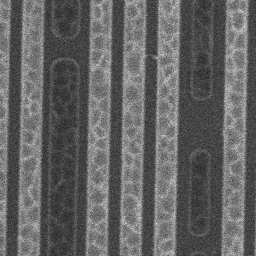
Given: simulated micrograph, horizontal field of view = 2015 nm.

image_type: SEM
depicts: parallel lines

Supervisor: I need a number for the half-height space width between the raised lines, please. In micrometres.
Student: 0.114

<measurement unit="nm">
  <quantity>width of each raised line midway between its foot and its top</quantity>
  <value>154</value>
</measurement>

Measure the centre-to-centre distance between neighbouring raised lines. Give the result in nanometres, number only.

267